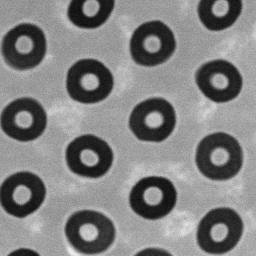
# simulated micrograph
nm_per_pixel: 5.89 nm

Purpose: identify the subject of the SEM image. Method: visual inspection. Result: a regular array of ring-shaped grooves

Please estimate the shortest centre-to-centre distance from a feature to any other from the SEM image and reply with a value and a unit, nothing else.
430 nanometers